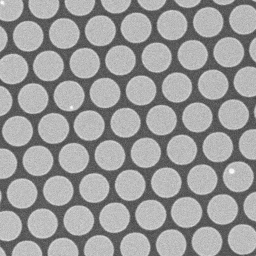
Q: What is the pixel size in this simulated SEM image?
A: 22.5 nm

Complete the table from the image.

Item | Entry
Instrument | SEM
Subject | an array of small figures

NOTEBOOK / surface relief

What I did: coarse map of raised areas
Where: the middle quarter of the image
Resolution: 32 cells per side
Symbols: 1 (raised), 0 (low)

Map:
00111111100111111000111111000011
00111111000111111000011110000000
00011111000001100000000000011100
00000000000000000111100000111110
11100000111110001111110001111111
11110001111110001111111001111111
11111001111111001111111001111111
11111001111111001111111001111110
11111001111111001111110000111110
11111001111110000111110000000000
11110000011100000000000110000001
11100000000000111000001111100011
00001111100001111100011111110011
00011111100011111110011111110011
10011111110011111110011111110011
10011111110011111110011111110011
10011111110011111100001111100001
10011111100001111100000110000000
00001111000000000000000000011111
00000000001110000011111000111111
11111000011111000111111100111111
11111000111111100111111100111111
11111100111111100111111100111111
11111100111111100111111100111111
11111100111111100011111000011111
11111100011111000001110000000000
11111000000000000000000011100000
00000001000000111110000111110001
00000111110001111111001111111001
10001111111001111111001111111001
11001111111001111111001111111001
11001111111001111111001111111000